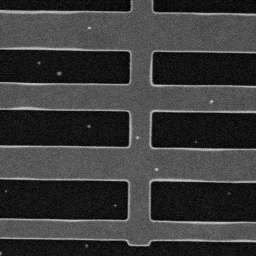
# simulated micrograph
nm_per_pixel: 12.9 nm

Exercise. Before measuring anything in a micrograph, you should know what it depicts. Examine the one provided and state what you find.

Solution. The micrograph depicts groups of lines, slits or small figures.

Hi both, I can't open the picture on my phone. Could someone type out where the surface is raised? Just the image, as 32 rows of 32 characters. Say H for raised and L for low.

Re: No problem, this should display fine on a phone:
LLLLLLLLLLLLLLLLHHHLLLLLLLLLLLLL
HHLLLHLLLHHHHLLLHHHHLLLLLLLLLLLL
HHHHHHHHHHHHHHHHHHHHHHHHHHHHHHHH
HHHHHHHHHHHHHHHHHHHHHHHHHHHHHHHH
HHHHHHHHHHHHHHHHHHHHHHHHHHHHHHHH
HHHHHHHHHHHHHHHHHHHHHHHHHHHHHHHH
LLLLLLLLLLLLLLLLHHHHLLLLLHHHHHHH
LLLLLLLLLLLLLLLLHHHLLLLLLLLLLLLL
LLLLLLLLLLLLLLLLHHHLLLLLLLLLLLLL
LLLLLLLLLLLLLLLLHHHLLLLLLLLLLLLL
HHHLLLLLLLLLLLLLHHHLLLLLLLLLLLLL
HHHHHHHHHHHHHHHHHHHHHHHHHHHHHHHH
HHHHHHHHHHHHHHHHHHHHHHHHHHHHHHHH
HHHHHHHHHHHHHHHHHHHHHHHHHHHHHHHH
LLLLLLLLLLLLLLLLHHHLLLLLLLLLLLLL
LLLLLLLLLLLLLLLLHHHLLLLLLLLLLLLL
LLLLLLLLLLLLLLLLHHHLLLLLLLLLLLLL
LLLLLLLLLLLLLLLLHHHLLLLLLLLLLLLL
HHHHHHHHHHHHHHHHHHHHLLLLLLLLLLLL
HHHHHHHHHHHHHHHHHHHHHHHHHHHHHHHH
HHHHHHHHHHHHHHHHHHHHHHHHHHHHHHHH
HHHHHHHHHHHHHHHHHHHHHHHHHHHHHHHH
LLLLLLLLLLLLHHHHHHHHLHHHHHHHHHHH
LLLLLLLLLLLLLLLLHHHLLLLLLLLLLLLL
LLLLLLLLLLLLLLLLHHHLLLLLLLLLLLLL
LLLLLLLLLLLLLLLLHHHLLLLLLLLLLLLL
LLLLLLLLLLLLLLLLHHHLLLLLLLLLLLLL
HHHHHHHLLLLLLLLHHHHLLLLLLLLLLLLL
HHHHHHHHHHHHHHHHHHHHHHHHHHHHHHHH
HHHHHHHHHHHHHHHHHHHHHHHHHHHHHHHH
LLLLLLLLLLLLLLLLHHHLLLLLLLLLLLLL
LLLLLLLLLLLLLLLLLLLLLLLLLLLLLLLL